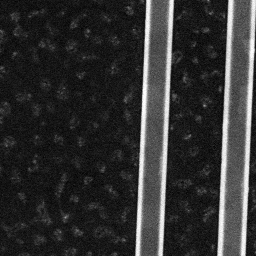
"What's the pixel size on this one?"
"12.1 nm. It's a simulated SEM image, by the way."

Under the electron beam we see one or a few lines or trenches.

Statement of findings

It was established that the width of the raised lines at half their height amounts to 0.294 um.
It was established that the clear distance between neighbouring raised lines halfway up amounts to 694 nanometres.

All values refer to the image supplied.